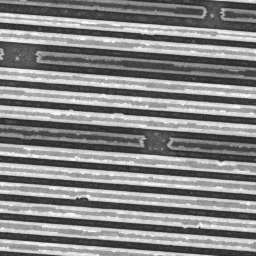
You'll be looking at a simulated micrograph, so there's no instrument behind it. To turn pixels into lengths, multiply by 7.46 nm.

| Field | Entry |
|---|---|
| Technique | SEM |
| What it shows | parallel lines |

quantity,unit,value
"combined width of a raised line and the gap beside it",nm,142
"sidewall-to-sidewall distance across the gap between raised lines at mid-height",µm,0.0688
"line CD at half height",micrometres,0.0688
